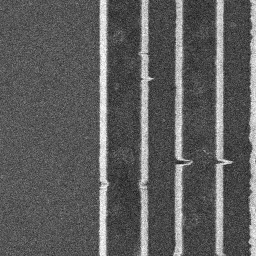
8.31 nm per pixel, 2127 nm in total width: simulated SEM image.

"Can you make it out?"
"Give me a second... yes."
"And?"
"one or a few lines or trenches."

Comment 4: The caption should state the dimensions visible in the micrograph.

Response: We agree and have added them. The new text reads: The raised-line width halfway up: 355 nm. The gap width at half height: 274 nanometers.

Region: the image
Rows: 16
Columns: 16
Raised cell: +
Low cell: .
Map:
......+++..+++..
......+++..+++..
......+++..+++..
......+++..+++..
......+++..+++..
......+++..+++..
......+++..+++..
......+++..+++..
......+++..+++..
......+++..+++..
......+++..+++..
......+++..+++..
......+++..+++..
......+++..+++..
......+++..+++..
......+++..+++..